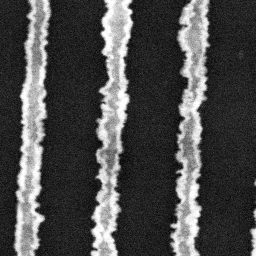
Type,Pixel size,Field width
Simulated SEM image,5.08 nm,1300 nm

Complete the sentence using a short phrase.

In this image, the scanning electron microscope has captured one or a few lines or trenches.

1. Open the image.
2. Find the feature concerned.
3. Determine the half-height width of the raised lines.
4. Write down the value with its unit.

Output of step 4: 0.071 µm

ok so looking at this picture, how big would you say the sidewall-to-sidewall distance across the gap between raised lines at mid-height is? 64.4 px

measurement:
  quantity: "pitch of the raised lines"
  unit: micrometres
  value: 0.402